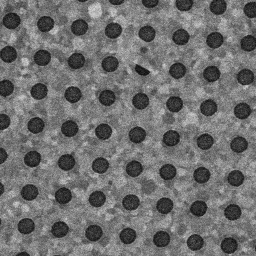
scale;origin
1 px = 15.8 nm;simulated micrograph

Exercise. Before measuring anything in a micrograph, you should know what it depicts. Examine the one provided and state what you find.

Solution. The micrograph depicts a regular array of holes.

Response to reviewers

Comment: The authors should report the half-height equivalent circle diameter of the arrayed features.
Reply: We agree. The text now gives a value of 276 nm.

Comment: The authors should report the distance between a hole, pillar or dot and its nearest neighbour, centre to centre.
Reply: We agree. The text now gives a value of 531 nm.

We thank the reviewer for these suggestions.